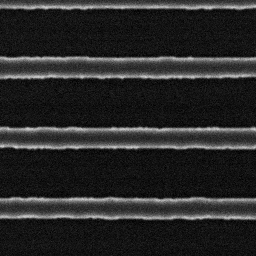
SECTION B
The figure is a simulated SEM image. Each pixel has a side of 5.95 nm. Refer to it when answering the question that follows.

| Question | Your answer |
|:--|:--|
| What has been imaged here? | lines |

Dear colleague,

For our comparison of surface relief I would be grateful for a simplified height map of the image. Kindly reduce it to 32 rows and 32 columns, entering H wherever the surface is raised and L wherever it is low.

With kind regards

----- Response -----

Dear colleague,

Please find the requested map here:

HHHHHHHHHHHHHHHHHHHHHHHHHHHHHHHH
LLLLLLLLLLLLLLLLLLLLLLLLLLLLLLLL
LLLLLLLLLLLLLLLLLLLLLLLLLLLLLLLL
LLLLLLLLLLLLLLLLLLLLLLLLLLLLLLLL
LLLLLLLLLLLLLLLLLLLLLLLLLLLLLLLL
LLLLLLLLLLLLLLLLLLLLLLLLLLLLLLLL
LLLLLLLLLLLLLLLLLLLLLLLLLLLLLLLL
HHHHHHHHHHHHHHHHHHHHHHHHHHHHHHHH
HHHHHHHHHHHHHHHHHHHHHHHHHHHHHHHH
HHHHHHHHHHHHHHHHHHHHHHHHHHHHHHHH
LLLLLLLLLLLLLLLLLLLLLLLLLLLLLLLL
LLLLLLLLLLLLLLLLLLLLLLLLLLLLLLLL
LLLLLLLLLLLLLLLLLLLLLLLLLLLLLLLL
LLLLLLLLLLLLLLLLLLLLLLLLLLLLLLLL
LLLLLLLLLLLLLLLLLLLLLLLLLLLLLLLL
LLLLLLLLLLLLLLLLLLLLLLLLLLLLLLLL
HHHHHHHHHHHHHHHHHHHHHHHHHHHHHHHH
HHHHHHHHHHHHHHHHHHHHHHHHHHHHHHHH
LLHHHHHHHHLLLLHLHHLLLHHHLHHHHHHH
LLLLLLLLLLLLLLLLLLLLLLLLLLLLLLLL
LLLLLLLLLLLLLLLLLLLLLLLLLLLLLLLL
LLLLLLLLLLLLLLLLLLLLLLLLLLLLLLLL
LLLLLLLLLLLLLLLLLLLLLLLLLLLLLLLL
LLLLLLLLLLLLLLLLLLLLLLLLLLLLLLLL
LLLLLLLLLLLLLLLLLLLLLLLLLLLLLLLL
HHHHHHHHHHHHHHHHHHHHHHHHHHHHHHHH
HHHHHHHHHHHHHHHHHHHHHHHHHHHHHHHH
LLLLLLLLLLLLLLLLLLLLLLLLLLLLLLLL
LLLLLLLLLLLLLLLLLLLLLLLLLLLLLLLL
LLLLLLLLLLLLLLLLLLLLLLLLLLLLLLLL
LLLLLLLLLLLLLLLLLLLLLLLLLLLLLLLL
LLLLLLLLLLLLLLLLLLLLLLLLLLLLLLLL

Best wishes